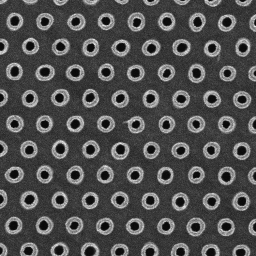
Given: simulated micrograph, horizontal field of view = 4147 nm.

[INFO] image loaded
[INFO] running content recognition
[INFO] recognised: a regular array of ring-shaped raised bodies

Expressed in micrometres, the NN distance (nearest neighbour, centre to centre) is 0.469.